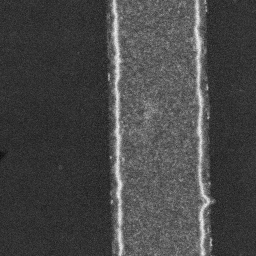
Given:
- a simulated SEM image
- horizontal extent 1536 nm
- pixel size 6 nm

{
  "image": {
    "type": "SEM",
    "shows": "one or a few lines or trenches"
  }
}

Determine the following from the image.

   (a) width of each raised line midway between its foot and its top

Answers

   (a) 491 nm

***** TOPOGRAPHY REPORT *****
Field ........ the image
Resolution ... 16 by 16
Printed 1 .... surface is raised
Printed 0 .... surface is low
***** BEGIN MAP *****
0000000111110000
0000000111110000
0000000111110000
0000000111110000
0000000111110000
0000000111110000
0000000111111000
0000000111110000
0000000111111000
0000000111111000
0000000111111000
0000000111111000
0000000111111000
0000000011111000
0000000111111000
0000000011111000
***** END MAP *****